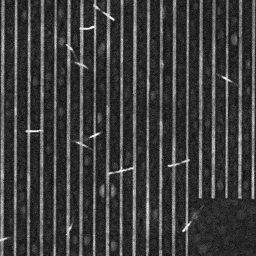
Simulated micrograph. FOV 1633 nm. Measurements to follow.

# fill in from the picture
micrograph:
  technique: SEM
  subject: parallel lines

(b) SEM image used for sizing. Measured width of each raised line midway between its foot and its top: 17.5 nanometers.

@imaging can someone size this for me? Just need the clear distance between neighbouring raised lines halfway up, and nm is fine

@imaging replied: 70.2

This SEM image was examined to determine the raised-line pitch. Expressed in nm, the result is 84.2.